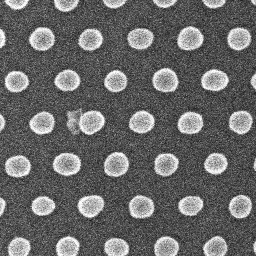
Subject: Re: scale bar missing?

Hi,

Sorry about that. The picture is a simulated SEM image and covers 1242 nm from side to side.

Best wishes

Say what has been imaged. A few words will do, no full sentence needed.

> a regular array of raised bodies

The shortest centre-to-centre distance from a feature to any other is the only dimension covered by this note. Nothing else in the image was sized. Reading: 231 nanometres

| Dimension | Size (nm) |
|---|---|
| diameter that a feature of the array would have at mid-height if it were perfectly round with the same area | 107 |